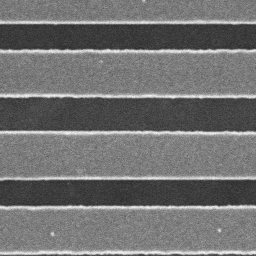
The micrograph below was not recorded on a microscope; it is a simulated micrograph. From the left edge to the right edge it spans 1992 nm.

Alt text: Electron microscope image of lines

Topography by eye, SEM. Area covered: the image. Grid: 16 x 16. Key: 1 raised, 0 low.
1111111111111111
0000000000000000
0000000000000000
1111111111111111
1111111111111111
1111111111111111
0000000000000000
0000000000000000
1111111111111111
1111111111111111
1111111111111111
0000000000000000
0000000000000000
1111111111111111
1111111111111111
1111111111111111